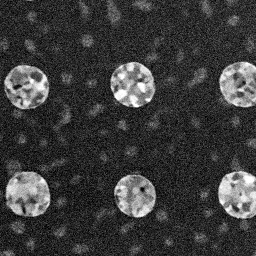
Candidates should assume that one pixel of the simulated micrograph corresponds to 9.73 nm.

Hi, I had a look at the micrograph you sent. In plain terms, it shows raised bodies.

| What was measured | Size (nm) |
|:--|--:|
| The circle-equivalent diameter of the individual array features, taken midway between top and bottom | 426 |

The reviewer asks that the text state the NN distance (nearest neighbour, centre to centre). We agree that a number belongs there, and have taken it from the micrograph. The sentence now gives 1.04 um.